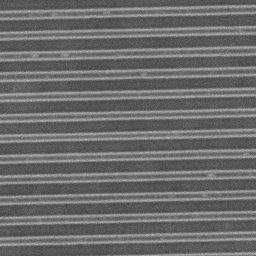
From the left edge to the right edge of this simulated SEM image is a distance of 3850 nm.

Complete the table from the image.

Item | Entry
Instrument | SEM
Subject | parallel lines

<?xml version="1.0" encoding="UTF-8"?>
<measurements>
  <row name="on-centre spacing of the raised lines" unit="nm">309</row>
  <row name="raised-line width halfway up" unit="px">7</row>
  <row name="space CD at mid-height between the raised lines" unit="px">13.9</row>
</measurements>